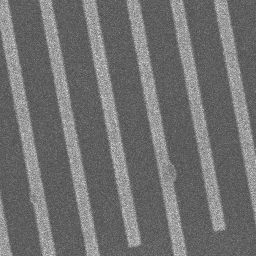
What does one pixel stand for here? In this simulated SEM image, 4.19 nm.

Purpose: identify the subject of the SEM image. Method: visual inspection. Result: parallel lines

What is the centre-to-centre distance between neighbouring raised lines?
180 nm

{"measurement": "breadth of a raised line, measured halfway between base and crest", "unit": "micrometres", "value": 0.0489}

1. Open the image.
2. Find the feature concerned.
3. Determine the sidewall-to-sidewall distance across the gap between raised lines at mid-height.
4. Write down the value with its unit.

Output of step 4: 133 nm